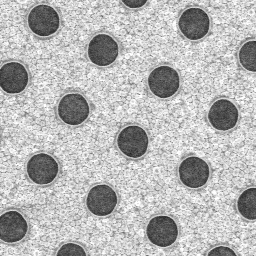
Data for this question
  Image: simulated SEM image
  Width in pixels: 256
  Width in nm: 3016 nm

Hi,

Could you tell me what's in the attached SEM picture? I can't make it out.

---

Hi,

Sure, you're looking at a regular array of holes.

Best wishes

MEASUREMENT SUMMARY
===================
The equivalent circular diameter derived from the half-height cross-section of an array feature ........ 373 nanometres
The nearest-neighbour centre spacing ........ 777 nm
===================